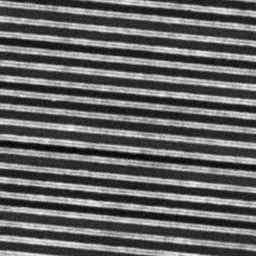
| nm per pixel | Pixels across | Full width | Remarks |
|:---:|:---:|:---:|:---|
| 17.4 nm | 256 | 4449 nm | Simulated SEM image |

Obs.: parallel lines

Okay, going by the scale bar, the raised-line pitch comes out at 253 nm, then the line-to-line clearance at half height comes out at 175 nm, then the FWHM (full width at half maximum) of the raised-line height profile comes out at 86.5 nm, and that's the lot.